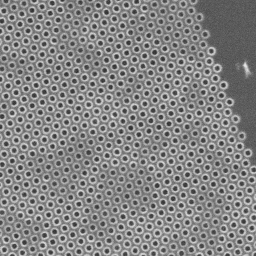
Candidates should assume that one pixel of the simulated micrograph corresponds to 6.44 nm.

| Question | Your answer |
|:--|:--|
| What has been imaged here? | a regular array of holes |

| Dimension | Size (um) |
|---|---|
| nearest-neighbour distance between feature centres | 0.0663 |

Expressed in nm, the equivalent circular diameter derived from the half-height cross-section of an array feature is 37.1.